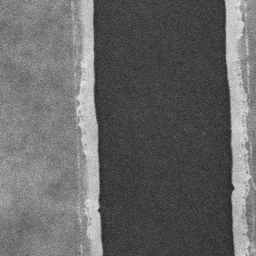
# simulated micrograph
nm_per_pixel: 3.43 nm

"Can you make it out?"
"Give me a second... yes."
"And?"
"one or a few lines or trenches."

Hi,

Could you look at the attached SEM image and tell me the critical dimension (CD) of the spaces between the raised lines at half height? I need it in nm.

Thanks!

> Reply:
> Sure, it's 495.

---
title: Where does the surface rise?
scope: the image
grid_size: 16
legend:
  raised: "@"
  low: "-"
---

@@@@@---------@@
@@@@@@--------@@
@@@@@@--------@@
@@@@@@--------@@
@@@@@@---------@
@@@@@@---------@
@@@@@@---------@
@@@@@@---------@
@@@@@@---------@
@@@@@@---------@
@@@@@@---------@
@@@@@@---------@
@@@@@@---------@
@@@@@@---------@
@@@@@@---------@
@@@@@@---------@